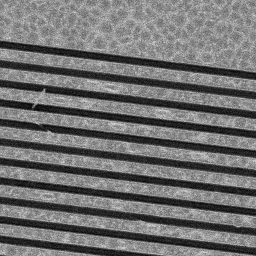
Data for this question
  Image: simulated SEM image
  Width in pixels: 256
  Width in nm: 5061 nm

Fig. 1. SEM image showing parallel lines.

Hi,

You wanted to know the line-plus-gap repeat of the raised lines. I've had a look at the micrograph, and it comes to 382 nanometers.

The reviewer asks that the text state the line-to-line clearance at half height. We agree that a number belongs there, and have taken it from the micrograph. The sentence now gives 137 nanometres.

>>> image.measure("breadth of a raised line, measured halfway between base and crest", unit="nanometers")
240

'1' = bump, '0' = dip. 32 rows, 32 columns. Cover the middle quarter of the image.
11111111111111111111000000000000
00000111111111111111111111110000
00000000000001111111111111111111
11110000000000000000011111111111
11111111111110000000000000000111
11111111111111111111000000000000
00001111111111111111111111110000
00000000000001111111111111111111
11111000000000000000011111111111
11111111111110000000000000000111
11111111111111111111100000000000
00000011111111111111111111111000
00000000000000111111111111111111
11111110000000000000001111111111
11111111111111100000000000000011
11111111111111111111111000000000
00000000111111111111111111111110
00000000000000001111111111111111
11111110000000000000000011111111
11111111111111110000000000000000
01111111111111111111111100000000
00000000011111111111111111111110
00000000000000000111111111111111
11111111000000000000000001111111
11111111111111110000000000000000
01111111111111111111111100000000
00000000011111111111111111111111
11000000000000000111111111111111
11111111110000000000000001111111
11111111111111111100000000000000
00111111111111111111111111000000
00000000001111111111111111111111